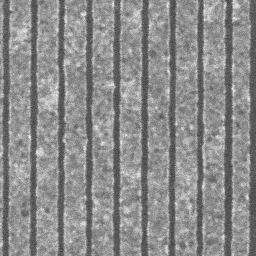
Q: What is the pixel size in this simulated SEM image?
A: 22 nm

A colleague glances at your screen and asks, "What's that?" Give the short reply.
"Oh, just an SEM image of parallel lines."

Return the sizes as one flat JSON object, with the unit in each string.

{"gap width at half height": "170 nm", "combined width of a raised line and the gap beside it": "0.607 microns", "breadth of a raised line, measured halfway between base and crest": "434 nm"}